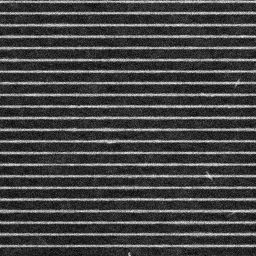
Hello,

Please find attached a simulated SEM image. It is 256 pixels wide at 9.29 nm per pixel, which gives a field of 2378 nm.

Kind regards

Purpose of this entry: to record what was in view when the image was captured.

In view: parallel lines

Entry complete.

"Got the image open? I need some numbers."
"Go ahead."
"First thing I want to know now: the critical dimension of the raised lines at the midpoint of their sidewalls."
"15.1 nanometers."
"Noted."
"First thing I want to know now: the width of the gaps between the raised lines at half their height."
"95.2 nanometres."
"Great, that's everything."